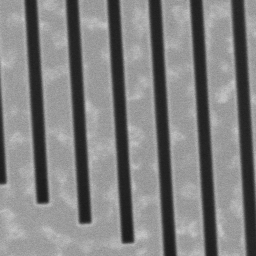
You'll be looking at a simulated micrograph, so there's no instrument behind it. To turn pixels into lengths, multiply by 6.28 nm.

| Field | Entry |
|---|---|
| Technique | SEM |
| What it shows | parallel lines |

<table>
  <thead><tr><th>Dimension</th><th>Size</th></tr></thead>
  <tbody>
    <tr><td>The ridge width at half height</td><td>0.193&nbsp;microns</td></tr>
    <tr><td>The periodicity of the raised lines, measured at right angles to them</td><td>259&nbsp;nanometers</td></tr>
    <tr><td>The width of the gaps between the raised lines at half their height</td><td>69.7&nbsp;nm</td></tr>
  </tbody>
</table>